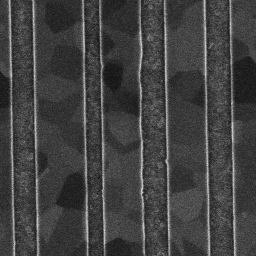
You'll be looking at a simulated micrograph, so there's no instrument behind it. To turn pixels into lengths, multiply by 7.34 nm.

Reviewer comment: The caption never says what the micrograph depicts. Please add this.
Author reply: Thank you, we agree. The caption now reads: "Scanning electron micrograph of one or a few lines or trenches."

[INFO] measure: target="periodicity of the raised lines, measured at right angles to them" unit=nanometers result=464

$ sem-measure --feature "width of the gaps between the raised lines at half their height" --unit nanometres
172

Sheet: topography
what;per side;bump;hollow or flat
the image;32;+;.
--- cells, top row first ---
+...++++++...+++++...+++++...+++
+...++++++...++++....+++++...+++
+...++++++...++++....+++++...+++
+...++++++...+++++...+++++...+++
+...++++++...+++++...+++++...+++
+...+++++++..+++++...+++++...+++
+...+++++++..+++++...+++++...+++
+...++++++...+++++...+++++...+++
+...++++++...++++....+++++...+++
+...++++++...++++....+++++...+++
+...+++++++..+++++...+++++...+++
+...+++++++..+++++...+++++...+++
+...+++++++..+++++...+++++...+++
+...+++++++..+++++...+++++...+++
+...+++++++..+++++...+++++...+++
+...+++++++..+++++...+++++...+++
+...+++++++..+++++...+++++...+++
++..+++++++..+++++...+++++...+++
+...+++++++..+++++...+++++...+++
++..+++++++..+++++...+++++...+++
++..+++++++..+++++...+++++...+++
++...++++++..+++++...+++++...+++
++...++++++..+++++...+++++...+++
++...++++++..+++++...+++++...+++
++...++++++..+++++...+++++...+++
++...++++++..+++++...+++++...+++
++...++++++..+++++...+++++...+++
++...++++++..+++++...+++++...+++
++...++++++..+++++...+++++...+++
++...++++++..+++++...+++++...+++
++...++++++..+++++...+++++...+++
++...++++++..+++++...+++++...+++